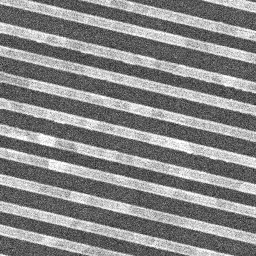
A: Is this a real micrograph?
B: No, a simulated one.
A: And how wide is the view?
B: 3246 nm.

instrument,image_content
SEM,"parallel lines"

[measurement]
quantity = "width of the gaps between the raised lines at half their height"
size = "0.225 um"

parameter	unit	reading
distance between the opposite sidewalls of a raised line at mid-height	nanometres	97.3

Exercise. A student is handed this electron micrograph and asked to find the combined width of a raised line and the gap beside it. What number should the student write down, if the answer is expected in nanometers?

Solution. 316